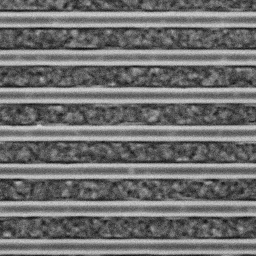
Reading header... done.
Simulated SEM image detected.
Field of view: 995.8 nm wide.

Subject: parallel lines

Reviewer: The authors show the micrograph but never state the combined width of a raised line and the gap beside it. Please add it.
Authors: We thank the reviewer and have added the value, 147 nm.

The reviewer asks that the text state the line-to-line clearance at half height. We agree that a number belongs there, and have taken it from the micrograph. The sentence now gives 98.8 nm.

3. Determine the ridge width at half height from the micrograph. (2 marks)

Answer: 49.2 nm